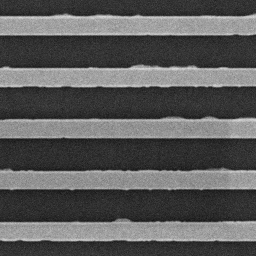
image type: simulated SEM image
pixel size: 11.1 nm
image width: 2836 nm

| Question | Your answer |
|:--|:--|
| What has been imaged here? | lines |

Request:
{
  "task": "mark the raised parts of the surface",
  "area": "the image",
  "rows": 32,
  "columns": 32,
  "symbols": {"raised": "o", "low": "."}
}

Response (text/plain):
................................
................................
oooooooooooooooooooooooooooooooo
oooooooooooooooooooooooooooooooo
................................
................................
................................
................................
................................
oooooooooooooooooooooooooooooooo
oooooooooooooooooooooooooooooooo
................................
................................
................................
................................
oooooooooooooooooooooooooooooooo
oooooooooooooooooooooooooooooooo
................................
................................
................................
................................
oooooooooooooooooooooooooooooooo
oooooooooooooooooooooooooooooooo
oooooooooooooooooooooooooooooooo
................................
................................
................................
................................
oooooooooooooooooooooooooooooooo
oooooooooooooooooooooooooooooooo
................................
................................